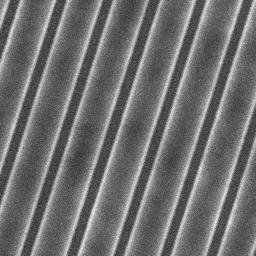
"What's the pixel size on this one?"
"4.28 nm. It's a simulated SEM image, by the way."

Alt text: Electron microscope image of parallel lines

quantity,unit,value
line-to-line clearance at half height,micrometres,0.0504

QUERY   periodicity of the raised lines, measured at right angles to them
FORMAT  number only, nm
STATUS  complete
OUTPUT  190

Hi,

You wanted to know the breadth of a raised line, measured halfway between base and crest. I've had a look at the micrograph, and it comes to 32.2 px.